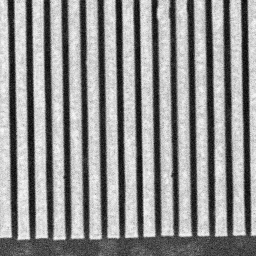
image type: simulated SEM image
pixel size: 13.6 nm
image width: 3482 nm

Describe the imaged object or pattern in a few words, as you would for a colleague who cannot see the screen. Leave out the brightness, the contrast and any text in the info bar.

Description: parallel lines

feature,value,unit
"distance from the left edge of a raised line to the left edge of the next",244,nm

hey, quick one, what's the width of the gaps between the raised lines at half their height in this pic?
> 95.2 nm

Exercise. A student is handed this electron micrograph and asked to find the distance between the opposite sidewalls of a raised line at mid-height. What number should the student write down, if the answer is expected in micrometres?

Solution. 0.148